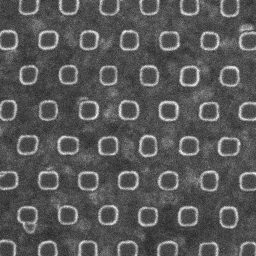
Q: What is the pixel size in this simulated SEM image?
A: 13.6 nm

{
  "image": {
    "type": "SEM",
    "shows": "a regular array of raised bodies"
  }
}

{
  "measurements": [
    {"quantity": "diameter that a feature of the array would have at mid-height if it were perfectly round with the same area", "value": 268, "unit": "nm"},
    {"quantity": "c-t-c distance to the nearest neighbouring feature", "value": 540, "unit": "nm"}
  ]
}